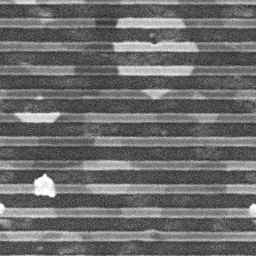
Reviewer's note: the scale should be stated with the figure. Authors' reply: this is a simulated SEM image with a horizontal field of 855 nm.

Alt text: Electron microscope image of parallel lines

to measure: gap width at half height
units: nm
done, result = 51.3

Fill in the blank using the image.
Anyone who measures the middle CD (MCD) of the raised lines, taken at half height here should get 28.8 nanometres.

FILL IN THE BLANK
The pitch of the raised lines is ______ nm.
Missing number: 79